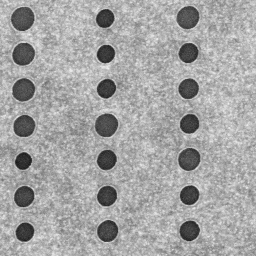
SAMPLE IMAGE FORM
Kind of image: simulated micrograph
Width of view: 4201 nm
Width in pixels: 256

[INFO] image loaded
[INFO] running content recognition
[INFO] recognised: a regular array of holes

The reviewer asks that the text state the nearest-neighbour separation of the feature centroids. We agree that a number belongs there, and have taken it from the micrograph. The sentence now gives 581 nm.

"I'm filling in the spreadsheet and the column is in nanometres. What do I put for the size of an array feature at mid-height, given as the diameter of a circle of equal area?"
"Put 341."